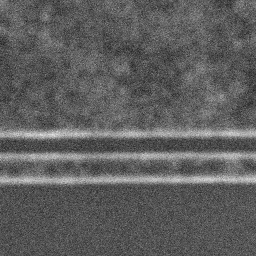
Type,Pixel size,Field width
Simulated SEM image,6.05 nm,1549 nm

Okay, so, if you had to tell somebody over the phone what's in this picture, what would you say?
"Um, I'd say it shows wiring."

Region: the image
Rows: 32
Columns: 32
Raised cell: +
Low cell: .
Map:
++++++++++++++++++++++++++++++++
++++++++++++++++++++++++++++++++
++++++++++++++++++++++++++++++++
++++++++++++++++++++++++++++++++
++++++++++++++++++++++++++++++++
++++++++++++++++++++++++++++++++
++++++++++++++++++++++++++++++++
++++++++++++++++++++++++++++++++
++++++++++++++++++++++++++++++++
++++++++++++++++++++++++++++++++
++++++++++++++++++++++++++++++++
++++++++++++++++++++++++++++++++
++++++++++++++++++++++++++++++++
++++++++++++++++++++++++++++++++
++++++++++++++++++++++++++++++++
++++++++++++++++++++++++++++++++
++++++++++++++++++++++++++++++++
................................
................................
.+++++++++++++++++++++++++++++++
++++++++++++++++++++++++++++++++
++++++++++++++++++++++++++++++++
+++++++++++++++++++++++++...++++
................................
................................
................................
................................
................................
................................
................................
................................
................................